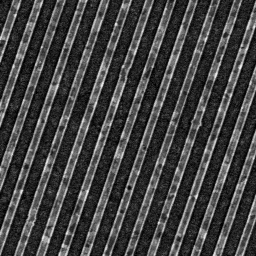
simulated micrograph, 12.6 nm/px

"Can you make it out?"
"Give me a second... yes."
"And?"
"parallel lines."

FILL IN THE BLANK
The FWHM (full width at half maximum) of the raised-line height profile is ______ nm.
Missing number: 80.2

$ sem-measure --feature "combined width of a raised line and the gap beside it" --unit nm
262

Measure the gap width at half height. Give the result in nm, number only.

181